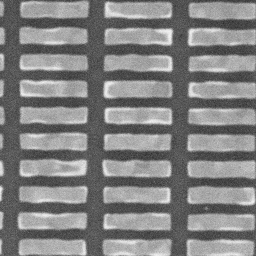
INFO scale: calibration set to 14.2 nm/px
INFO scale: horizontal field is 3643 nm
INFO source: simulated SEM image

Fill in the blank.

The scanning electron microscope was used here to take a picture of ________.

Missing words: groups of lines, slits or small figures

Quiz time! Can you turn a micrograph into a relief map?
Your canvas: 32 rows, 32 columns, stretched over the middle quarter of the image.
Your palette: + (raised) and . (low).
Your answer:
++++++....++++++++++++++++.....+
...........+......+++...........
................................
................................
+++++.......++++++++++++........
++++++.....++++++++++++++++.....
++++++.....++++++++++++++++.....
++++++.....++++++++++++++++.....
................................
................................
................................
++++++.....+++++++++++++++......
++++++.....++++++++++++++++....+
+++++......++++++++++++++++....+
+++++......++++++++++...+++....+
................................
................................
................................
++++++.....++++++++++++++++....+
++++++....++++++++++++++++.....+
++++++....++++++++++++++++.....+
..................+++...........
................................
................................
..........++++.+++++++++++......
+++++.....++++++++++++++++.....+
+++++.....++++++++++++++++.....+
...........+++++++++++++++.....+
................................
................................
................................
+++++.....++++++++++++++++.....+